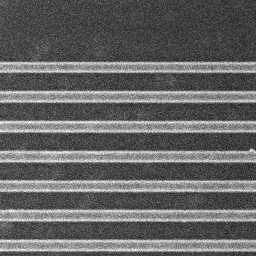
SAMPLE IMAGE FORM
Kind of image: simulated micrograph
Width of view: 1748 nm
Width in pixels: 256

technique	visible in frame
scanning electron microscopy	parallel lines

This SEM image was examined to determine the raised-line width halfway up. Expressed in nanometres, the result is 71.7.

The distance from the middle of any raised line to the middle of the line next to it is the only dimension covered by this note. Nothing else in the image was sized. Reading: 0.203 um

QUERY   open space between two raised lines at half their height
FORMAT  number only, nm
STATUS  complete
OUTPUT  132